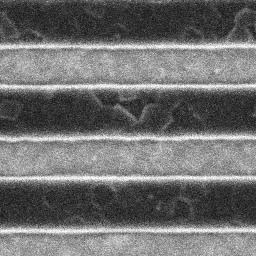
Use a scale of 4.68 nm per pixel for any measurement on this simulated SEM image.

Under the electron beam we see one or a few lines or trenches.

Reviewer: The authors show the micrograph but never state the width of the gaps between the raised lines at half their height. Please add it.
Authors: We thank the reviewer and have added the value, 177 nm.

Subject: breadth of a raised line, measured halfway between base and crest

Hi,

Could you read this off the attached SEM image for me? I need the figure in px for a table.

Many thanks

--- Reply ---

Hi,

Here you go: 54.1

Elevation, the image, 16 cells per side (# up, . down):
################
################
################
................
................
################
################
################
################
................
................
################
################
################
................
................